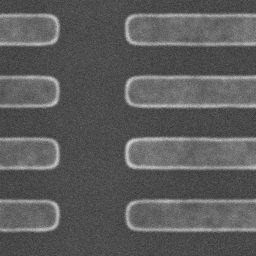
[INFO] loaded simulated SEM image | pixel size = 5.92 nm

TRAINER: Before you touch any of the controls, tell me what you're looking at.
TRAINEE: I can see groups of lines, slits or small figures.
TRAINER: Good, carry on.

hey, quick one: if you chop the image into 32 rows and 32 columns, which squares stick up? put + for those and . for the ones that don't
................................
................................
+++++++.........++++++++++++++++
+++++++.........++++++++++++++++
+++++++.........++++++++++++++++
..++++................++++++++++
................................
................................
................................
................................
+++++++.........++++++++++++++++
+++++++.........++++++++++++++++
+++++++.........++++++++++++++++
................................
................................
................................
................................
++++++...........+++++++++++++++
+++++++.........++++++++++++++++
+++++++.........++++++++++++++++
+++++++.........++++++++++++++++
................................
................................
................................
................................
+++++++.........++++++++++++++++
+++++++.........++++++++++++++++
+++++++.........++++++++++++++++
+++++++..........+++++++++++++++
................................
................................
................................